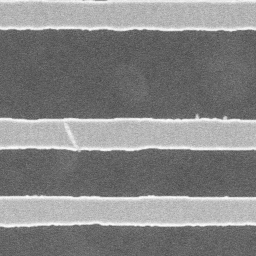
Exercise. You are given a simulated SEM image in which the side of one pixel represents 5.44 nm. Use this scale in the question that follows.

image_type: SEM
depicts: lines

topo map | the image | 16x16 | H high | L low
HHHHHHHHHHHHHHHH
HHHHHHHHHHHHHHHH
LLLLLLLLLLLLLLLL
LLLLLLLLLLLLLLLL
LLLLLLLLLLLLLLLL
LLLLLLLLLLLLLLLL
LLLLLLLLLLLLLLLL
HHHHHHHHHHHHHHHL
HHHHHHHHHHHHHHHH
LLLLLLLLLLLLLLLL
LLLLLLLLLLLLLLLL
LLLLLLLLLLLLLLLL
HHHHHHHHHHHHHHHH
HHHHHHHHHHHHHHHH
LLLLLLLLLLLLLLLL
LLLLLLLLLLLLLLLL